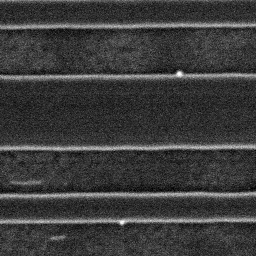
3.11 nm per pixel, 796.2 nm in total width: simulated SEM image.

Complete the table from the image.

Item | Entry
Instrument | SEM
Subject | groups of lines, slits or small figures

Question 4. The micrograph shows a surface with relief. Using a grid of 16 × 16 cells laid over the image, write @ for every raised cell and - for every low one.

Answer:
@@@@@@@@@@@@@@@@
@@@@@@@@@@@@@@@@
----------------
----------------
----------------
@@@@@@@@@@@@@@@@
@@@@@@@@@@@@@@@@
@@@@@@@@@@@@@@@@
@@@@@@@@@@@@@@@@
----------------
----------------
----------------
@@@@@@@@@@@@@@@@
@@@@@@@@@@@@@@@@
----------------
----------------